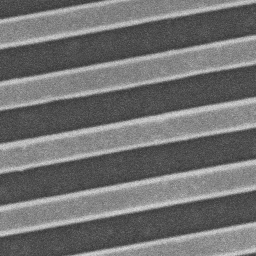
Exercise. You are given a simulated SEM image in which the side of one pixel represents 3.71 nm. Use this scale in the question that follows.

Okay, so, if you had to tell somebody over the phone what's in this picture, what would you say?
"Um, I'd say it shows one or a few lines or trenches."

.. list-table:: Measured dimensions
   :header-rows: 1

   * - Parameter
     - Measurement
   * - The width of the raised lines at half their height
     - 95.7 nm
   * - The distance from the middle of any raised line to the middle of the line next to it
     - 0.227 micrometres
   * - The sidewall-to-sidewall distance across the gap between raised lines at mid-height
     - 0.132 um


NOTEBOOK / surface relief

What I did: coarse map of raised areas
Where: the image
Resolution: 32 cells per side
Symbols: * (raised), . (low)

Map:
............*****************...
.......*****************........
.*****************..............
*************...................
********........................
**.........................*****
......................**********
.................***************
...........*****************....
......*****************.........
******************..............
************....................
******..........................
*.........................******
.....................***********
...............*****************
..........*****************.....
....******************..........
****************................
***********.....................
*****.........................**
.........................*******
...................*************
..............******************
.........******************.....
...******************...........
***************.................
**********......................
*****........................***
.......................*********
..................**************
.............******************.